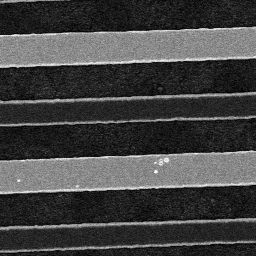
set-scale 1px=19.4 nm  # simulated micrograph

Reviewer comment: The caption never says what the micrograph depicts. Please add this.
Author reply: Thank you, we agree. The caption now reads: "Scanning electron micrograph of lines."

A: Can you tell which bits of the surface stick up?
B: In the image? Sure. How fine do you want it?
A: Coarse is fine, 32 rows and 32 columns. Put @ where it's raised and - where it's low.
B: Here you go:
--------------------------------
--------------------------------
--------------------------------
-----------------------------@@@
@@@@@@@@@@@@@@@@@@@@@@@@@@@@@@@@
@@@@@@@@@@@@@@@@@@@@@@@@@@@@@@@@
@@@@@@@@@@@@@@@@@@@@@@@@@@@@@@@@
@@@@@@@@@@@@@@@@@@@@@@@@@-------
--------------------------------
--------------------------------
--------------------------------
--------------------------------
--------@@@@@@@@@@@@@@@@@@@@@@@@
@@@@@@@@@@@@@@@@@@@@@@@@@@@@@@@@
@@@@@@@@@@@@@@@@@@@@@@@@@@@@@@@@
@@@@@@@@@@----------------------
--------------------------------
--------------------------------
--------------------------------
----------------@@@@@@@@@@@@@@@@
@@@@@@@@@@@@@@@@@@@@@@@@@@@@@@@@
@@@@@@@@@@@@@@@@@@@@@@@@@@@@@@@@
@@@@@@@@@@@@@@@@@@@@@@@@@@@@@@@@
@@@@@@@@@@@@@@@@@@@-------------
--------------------------------
--------------------------------
--------------------------------
---------------------------@@@@@
@@@@@@@@@@@@@@@@@@@@@@@@@@@@@@@@
@@@@@@@@@@@@@@@@@@@@@@@@@@@@@@@@
@@@@@@@@@@@@@@@@@@@@@@@@@@------
@@------------------------------